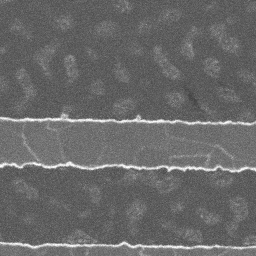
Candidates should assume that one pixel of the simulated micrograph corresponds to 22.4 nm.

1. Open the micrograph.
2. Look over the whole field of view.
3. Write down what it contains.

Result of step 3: one or a few lines or trenches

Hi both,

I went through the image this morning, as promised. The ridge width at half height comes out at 46.5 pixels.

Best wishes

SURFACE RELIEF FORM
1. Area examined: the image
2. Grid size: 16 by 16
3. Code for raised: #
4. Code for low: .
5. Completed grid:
................
................
................
................
................
................
................
######..........
################
################
.....#...#.#####
................
................
................
................
################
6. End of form